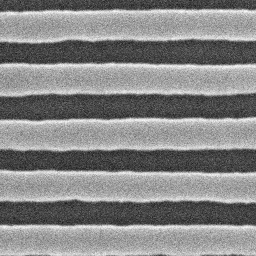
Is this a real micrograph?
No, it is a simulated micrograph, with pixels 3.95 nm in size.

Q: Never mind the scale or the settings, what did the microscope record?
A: lines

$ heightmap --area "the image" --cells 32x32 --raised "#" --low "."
................................
.....####..#####################
################################
################################
################################
................................
................................
................................
################################
################################
################################
################################
................................
................................
................................
################################
################################
################################
.###########################....
................................
................................
##...##.........................
################################
################################
################################
................................
................................
................................
################################
################################
################################
################################